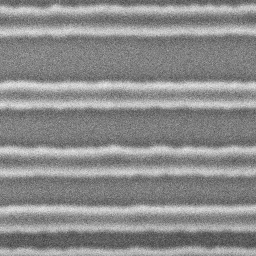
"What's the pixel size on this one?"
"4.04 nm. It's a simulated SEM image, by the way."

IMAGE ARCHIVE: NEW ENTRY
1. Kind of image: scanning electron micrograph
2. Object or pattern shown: lines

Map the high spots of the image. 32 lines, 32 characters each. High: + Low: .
................................
++++++++++++++++++++++++++++++++
++++++++++++++++++++++++++++++++
++++++++++++++++++++++++++++++++
................................
................................
................................
................................
................................
................................
+++++...+++.+++++..+++.++.++.+.+
++++++++++++++++++++++++++++++++
++++++++++++++++++++++++++++++++
................................
................................
................................
................................
................................
.+...........++....++..+....++..
++++++++++++++++++++++++++++++++
++++++++++++++++++++++++++++++++
++++++++++++++++++++++++++++++++
................................
................................
................................
................................
++++++++++++++++++++++++++++++++
++++++++++++++++++++++++++++++++
++++++++++++++++++++++++++++++++
................................
................................
++++++++++++++++++++++++++++++++